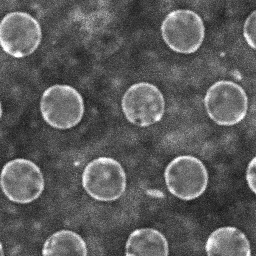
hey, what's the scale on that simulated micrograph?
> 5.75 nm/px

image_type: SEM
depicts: raised bodies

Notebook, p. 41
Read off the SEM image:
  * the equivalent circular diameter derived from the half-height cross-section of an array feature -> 243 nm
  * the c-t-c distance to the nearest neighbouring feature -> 471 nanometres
